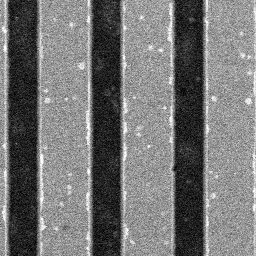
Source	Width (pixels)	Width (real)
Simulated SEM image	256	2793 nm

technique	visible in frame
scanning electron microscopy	one or a few lines or trenches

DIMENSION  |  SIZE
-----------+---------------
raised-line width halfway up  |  552 nm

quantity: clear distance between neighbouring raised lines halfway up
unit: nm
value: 346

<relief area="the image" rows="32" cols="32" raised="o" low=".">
o....oooooo....ooooooo....oooooo
o....oooooo....ooooooo....oooooo
o....oooooo....ooooooo....oooooo
o....oooooo....ooooooo....oooooo
o....oooooo....ooooooo....oooooo
o....oooooo....ooooooo....oooooo
o....oooooo....ooooooo....oooooo
o....oooooo....ooooooo....oooooo
o....oooooo....ooooooo....oooooo
o....oooooo....ooooooo....oooooo
o....oooooo....ooooooo....oooooo
o....oooooo....ooooooo....oooooo
o....oooooo....ooooooo....oooooo
o....oooooo....ooooooo....oooooo
o....oooooo....ooooooo....oooooo
o....oooooo....ooooooo....oooooo
o....oooooo....ooooooo....oooooo
o....oooooo....ooooooo....oooooo
o....oooooo....ooooooo....oooooo
o....oooooo....ooooooo....oooooo
o....oooooo....ooooooo....oooooo
o....oooooo....ooooooo....oooooo
o....oooooo....ooooooo....oooooo
o....oooooo....ooooooo....oooooo
o....oooooo....ooooooo....oooooo
o....oooooo....ooooooo....oooooo
o....oooooo....ooooooo....oooooo
o....oooooo....ooooooo....oooooo
o....oooooo....ooooooo....oooooo
o....oooooo....ooooooo....oooooo
o....oooooo....ooooooo....oooooo
o....oooooo....ooooooo....oooooo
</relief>